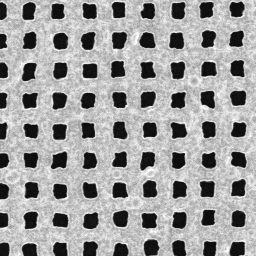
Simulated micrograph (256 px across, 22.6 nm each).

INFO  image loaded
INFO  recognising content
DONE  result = a regular array of holes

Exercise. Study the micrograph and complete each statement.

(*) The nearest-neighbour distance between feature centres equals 0.653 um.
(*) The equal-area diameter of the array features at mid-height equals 368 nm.